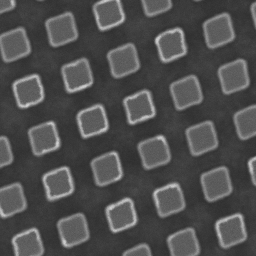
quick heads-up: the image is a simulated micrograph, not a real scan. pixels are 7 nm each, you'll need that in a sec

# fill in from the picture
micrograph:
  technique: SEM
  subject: a regular array of raised bodies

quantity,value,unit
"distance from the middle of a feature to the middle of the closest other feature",338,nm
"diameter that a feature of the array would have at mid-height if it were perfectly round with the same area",223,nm